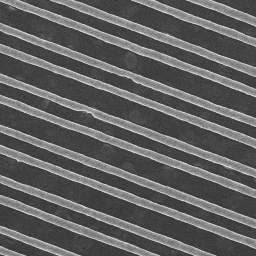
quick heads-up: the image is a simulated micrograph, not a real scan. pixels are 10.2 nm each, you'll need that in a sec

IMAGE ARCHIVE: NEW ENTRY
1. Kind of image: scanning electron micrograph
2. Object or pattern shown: parallel lines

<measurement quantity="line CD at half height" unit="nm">79.6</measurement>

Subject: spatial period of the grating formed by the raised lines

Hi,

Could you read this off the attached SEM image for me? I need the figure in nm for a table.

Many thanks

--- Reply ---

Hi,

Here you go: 240